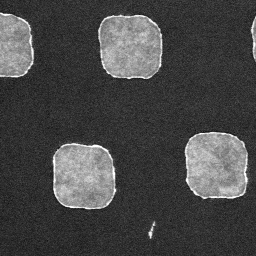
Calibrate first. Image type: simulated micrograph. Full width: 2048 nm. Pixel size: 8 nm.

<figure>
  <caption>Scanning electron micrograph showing raised bodies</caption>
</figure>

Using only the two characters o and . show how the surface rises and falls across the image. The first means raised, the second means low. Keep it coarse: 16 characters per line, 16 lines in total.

................
oo....oooo......
oo....oooo......
oo....oooo......
oo.....ooo......
................
................
................
............ooo.
....ooo.....ooo.
...oooo.....ooo.
...oooo.....ooo.
....ooo.........
................
................
................